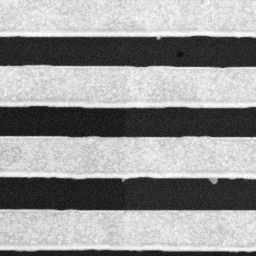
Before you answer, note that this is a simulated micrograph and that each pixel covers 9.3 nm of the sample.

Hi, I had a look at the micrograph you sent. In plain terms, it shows lines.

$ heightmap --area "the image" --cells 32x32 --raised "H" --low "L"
HHHHHHHHHHHHHHHHHHHHHHHHHHHHHHHH
HHHHHHHHHHHHHHHHHHHHHHHHHHHHHHHH
HHHHHHHHHHHHHHHHHHHHHHHHHHHHHHHH
HHHHHHHHHHHHHHHHHHHHHHHHHHHHHHHH
HLLHHHHHHHHHHHHHHHHHLLHHLLLHHHHH
LLLLLLLLLLLLLLLLLLLLLLLLLLLLLLLL
LLLLLLLLLLLLLLLLLLLLLLLLLLLLLLLL
LLLLLLLLLLLLLLLLLLLLLLLLLLLLLLLL
HHHHHHHHHHHHHHHHHHHHHHHHHHHLHHHH
HHHHHHHHHHHHHHHHHHHHHHHHHHHHHHHH
HHHHHHHHHHHHHHHHHHHHHHHHHHHHHHHH
HHHHHHHHHHHHHHHHHHHHHHHHHHHHHHHH
HHHHHHHHHHHHHHHHHHHHHHHHHHHHHHHH
LLLLLLLLLLLLLLLLLLLLLLLLLLLLLLLL
LLLLLLLLLLLLLLLLLLLLLLLLLLLLLLLL
LLLLLLLLLLLLLLLLLLLLLLLLLLLLLLLL
LLLLLLLLLLLLLLLLLLLLLLLLLLLLLLLL
HHHHHHHHHHHHHHHHHHHHHHHHHHHHHHHH
HHHHHHHHHHHHHHHHHHHHHHHHHHHHHHHH
HHHHHHHHHHHHHHHHHHHHHHHHHHHHHHHH
HHHHHHHHHHHHHHHHHHHHHHHHHHHHHHHH
HHHHHHHHHHHHHHHHHHHHHHHHHHHHHHHH
LLLLLLLLLLLLLLLLLLLLLLLLLLLLLLLL
LLLLLLLLLLLLLLLLLLLLLLLLLLLLLLLL
LLLLLLLLLLLLLLLLLLLLLLLLLLLLLLLL
LLLLLLLLLLLLLLLLLLLLLLLLLLLLLLLL
HHHHHHHHHHHHHHHHHHHHHHHHHHHHHHHH
HHHHHHHHHHHHHHHHHHHHHHHHHHHHHHHH
HHHHHHHHHHHHHHHHHHHHHHHHHHHHHHHH
HHHHHHHHHHHHHHHHHHHHHHHHHHHHHHHH
HHHHHHHHHHHHHHHHHHHHHHHHHHHHHHHH
LLLLLLLLLLLLLLLLLLLLLLLLLLLLLLLL